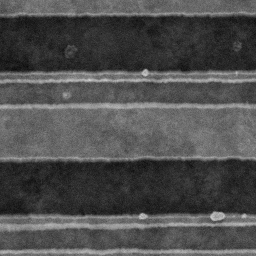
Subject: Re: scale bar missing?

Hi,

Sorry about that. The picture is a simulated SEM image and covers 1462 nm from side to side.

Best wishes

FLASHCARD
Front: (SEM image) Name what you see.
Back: lines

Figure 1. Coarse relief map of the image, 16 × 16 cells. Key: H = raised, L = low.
HHHHHHHHHHHHHHHH
LLLLLLLLLLLLLLLL
LLLLLLLLLLLLLLLL
LLLLLLLLLLLLLLLL
LLLLLLLLLLLLLLLL
HHHHHHHHHHHHHHHH
HHHHHHHHHHHHHHHH
HHHHHHHHHHHHHHHH
HHHHHHHHHHHHHHHH
HHHHHHHHHHHHHHHH
LLLLLLLLLLLLLLLL
LLLLLLLLLLLLLLLL
LLLLLLLLLLLLLLLL
LLLLLLLLHLLLLHLL
HHHHHHHHHHHHHHHH
HHHHHHHHHHHHHHHH